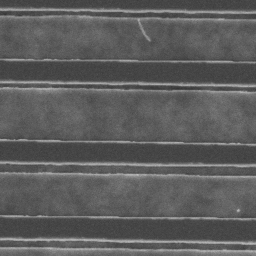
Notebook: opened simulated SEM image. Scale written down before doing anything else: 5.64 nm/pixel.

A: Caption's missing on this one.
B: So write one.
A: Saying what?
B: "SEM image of lines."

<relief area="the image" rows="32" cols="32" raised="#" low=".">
################################
................##...###########
................................
................................
................................
................................
................................
#######.........................
################################
################################
..............#..###############
................................
................................
................................
................................
................................
................................
#.#.............................
################################
################################
............####################
................................
................................
................................
................................
................................
................................
################################
################################
################################
................................
................................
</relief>